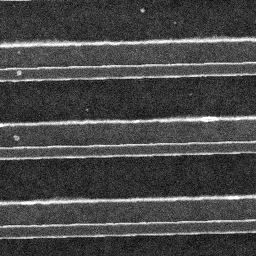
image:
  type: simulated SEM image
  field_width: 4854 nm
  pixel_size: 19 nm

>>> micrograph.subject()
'lines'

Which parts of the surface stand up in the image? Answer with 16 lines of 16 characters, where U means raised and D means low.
DDDDDDDDDDDDDDDD
DDDDDDDDDDDDDDDD
DDDDDDDDDDDDDDDD
UUUUUUUUUUUUUUUU
UUUUUUUUUUUUUUUU
DDDDDDDDDDDDDDDD
DDDDDDDDDDDDDDDD
DDDDDDDDDDDDUUUU
UUUUUUUUUUUUUUUU
UUUUUUUUUUUUUUUU
DDDDDDDDDDDDDDDD
DDDDDDDDDDDDDDDD
DDDDDDDDDDUUUUUU
UUUUUUUUUUUUUUUU
UUUUUUUUUUUUUUUU
DDDDDDDDDDDDDDDD